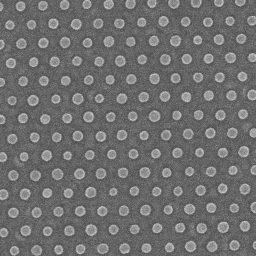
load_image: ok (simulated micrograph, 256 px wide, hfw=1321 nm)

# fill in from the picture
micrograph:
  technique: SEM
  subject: a regular array of raised bodies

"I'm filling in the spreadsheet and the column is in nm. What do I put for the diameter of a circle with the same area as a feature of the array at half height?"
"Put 49.1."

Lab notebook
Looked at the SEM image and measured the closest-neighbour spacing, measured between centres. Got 109 nm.